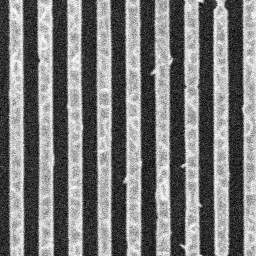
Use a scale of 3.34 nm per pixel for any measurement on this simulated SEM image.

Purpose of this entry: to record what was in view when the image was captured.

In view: parallel lines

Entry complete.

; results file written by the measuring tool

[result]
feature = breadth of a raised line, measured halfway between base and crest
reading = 42.2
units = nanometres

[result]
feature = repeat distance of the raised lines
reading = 97.8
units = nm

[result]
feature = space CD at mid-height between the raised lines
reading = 0.0573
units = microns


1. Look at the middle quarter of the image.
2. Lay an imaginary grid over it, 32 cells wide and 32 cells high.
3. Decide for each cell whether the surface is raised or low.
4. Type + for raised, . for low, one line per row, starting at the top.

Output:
.+++.....++.....+++....+++....++
.+++.....++.....+++....+++.....+
.+++.....+++....+++....+++.....+
.+++.....+++....+++....+++.....+
.+++....++++....+++....+++.....+
.+++....++++....+++....+++.....+
.+++....++++....+++....+++.....+
.+++....++++....+++....+++.....+
.+++.....+++....+++....+++.....+
.+++.....+++....+++....+++.....+
.+++.....+++....+++....+++.....+
.+++.....+++....+++....+++.....+
.+++.....+++....+++....+++.....+
.+++.....+++....+++....+++.....+
.+++.....+++....+++....+++.....+
.+++.....++.....+++....+++.....+
.+++.....++.....+++....+++.....+
.+++.....++.....+++....+++.....+
.+++.....++.....+++....+++.....+
.+++.....++.....+++....+++.....+
.+++.....++.....+++....+++.....+
.+++.....++.....+++....+++.....+
.+++.....++.....+++....+++.....+
.+++.....++.....+++....+++.....+
.+++.....++.....+++....+++....++
.+++.....++.....+++....+++....++
.+++.....++.....+++....+++.....+
.+++.....++.....+++....+++.....+
.+++.....++....++++....+++.....+
.+++.....++.....+++....+++.....+
.+++.....++.....+++....+++.....+
.+++.....++.....+++....+++.....+